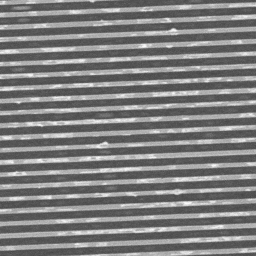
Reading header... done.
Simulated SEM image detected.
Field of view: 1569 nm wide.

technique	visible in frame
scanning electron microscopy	parallel lines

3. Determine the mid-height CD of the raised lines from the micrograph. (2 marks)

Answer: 26.8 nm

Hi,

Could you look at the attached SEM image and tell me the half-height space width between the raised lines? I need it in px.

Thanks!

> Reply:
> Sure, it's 7.86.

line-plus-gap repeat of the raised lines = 0.0753 µm